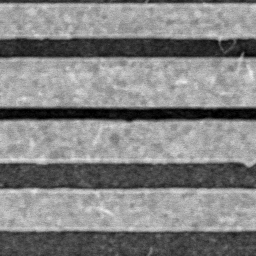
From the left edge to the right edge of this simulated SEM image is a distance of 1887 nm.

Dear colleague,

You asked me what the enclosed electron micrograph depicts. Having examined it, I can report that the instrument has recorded one or a few lines or trenches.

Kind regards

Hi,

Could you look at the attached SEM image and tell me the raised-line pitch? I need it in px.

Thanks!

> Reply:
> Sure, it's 63.1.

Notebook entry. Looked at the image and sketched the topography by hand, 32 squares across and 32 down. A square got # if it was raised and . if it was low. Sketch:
................................
################################
################################
################################
##########.#.###...#############
................................
................................
################################
################################
################################
################################
################################
################################
................................
................................
################################
################################
################################
################################
################################
................................
................................
................................
................................
################################
################################
################################
################################
################################
................................
................................
................................